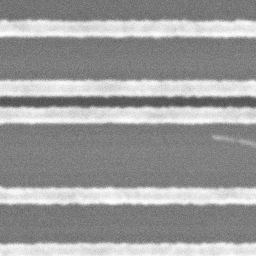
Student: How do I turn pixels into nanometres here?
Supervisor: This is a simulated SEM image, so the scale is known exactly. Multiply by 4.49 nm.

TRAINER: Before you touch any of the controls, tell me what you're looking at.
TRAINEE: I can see lines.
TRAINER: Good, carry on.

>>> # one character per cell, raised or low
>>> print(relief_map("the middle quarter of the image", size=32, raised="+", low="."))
................................
................................
................................
................................
++.+++++.+++++..++.++++..++.++++
++++++++++++++++++++++++++++++++
++++++++++++++++++++++++++++++++
++++++++++++++++++++++++++++++++
................................
................................
................................
++++++++++++++++++++++++++++++++
++++++++++++++++++++++++++++++++
++++++++++++++++++++++++++++++++
..................+.............
................................
................................
................................
................................
................................
................................
................................
................................
................................
................................
................................
................................
................................
................................
................................
................................
++++++++++++++++++++++++++++++++